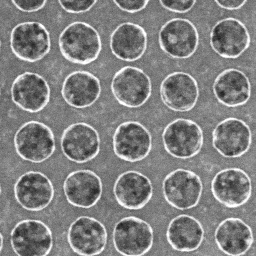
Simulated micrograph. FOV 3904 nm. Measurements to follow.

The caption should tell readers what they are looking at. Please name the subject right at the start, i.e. a regular array of raised bodies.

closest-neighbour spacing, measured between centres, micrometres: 0.714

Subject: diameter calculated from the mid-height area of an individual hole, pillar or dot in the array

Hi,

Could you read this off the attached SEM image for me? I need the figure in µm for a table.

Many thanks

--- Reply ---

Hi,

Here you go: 0.586